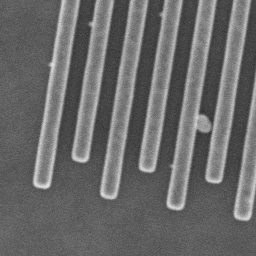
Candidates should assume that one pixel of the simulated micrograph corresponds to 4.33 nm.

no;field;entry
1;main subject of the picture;groups of lines, slits or small figures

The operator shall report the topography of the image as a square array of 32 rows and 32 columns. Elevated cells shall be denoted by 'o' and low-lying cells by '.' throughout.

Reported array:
........oo..oo..oo...oo..oo..oo.
........oo..oo..oo..ooo..oo..oo.
.......ooo..oo..oo..oo...oo..oo.
.......oo..ooo..oo..oo..ooo..oo.
.......oo..ooo..oo..oo..oo..ooo.
.......oo..oo..ooo..oo..oo..ooo.
.......oo..oo..oo...oo..oo..oo..
.......oo..oo..oo..ooo..oo..oo..
......ooo..oo..oo..oo...oo..oo..
......oo...oo..oo..oo..ooo..oo..
......oo..ooo..oo..oo..oo...oo..
......oo..oo...oo..oo..oo..oo...
......oo..oo..ooo..oo..oo..oo..o
......oo..oo..oo...oo..oo..oo..o
......oo..oo..oo..oo...oo..oo..o
.....oo...oo..oo..oo...oo..oo..o
.....oo..ooo..oo..oo..oo...oo..o
.....oo..oo...oo..oo..oo..ooo..o
.....oo..oo..oo...oo..oo..oo...o
.....oo..oo..oo...oo..oo..oo..oo
....ooo......oo..oo...oo..oo..oo
....ooo......oo.......oo..oo..oo
....oo.......oo......oo...oo..oo
.............oo......oo.......oo
.............o.......oo.......oo
.....................oo......ooo
.............................oo.
................................
................................
................................
................................
................................